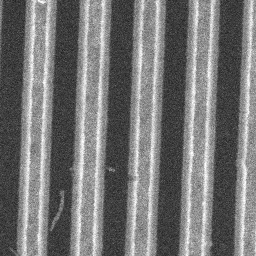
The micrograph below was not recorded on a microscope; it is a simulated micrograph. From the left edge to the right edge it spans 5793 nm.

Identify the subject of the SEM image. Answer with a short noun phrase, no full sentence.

parallel lines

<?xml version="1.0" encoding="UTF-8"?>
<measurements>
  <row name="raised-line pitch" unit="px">54.4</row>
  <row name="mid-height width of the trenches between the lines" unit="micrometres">0.726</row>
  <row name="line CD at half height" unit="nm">492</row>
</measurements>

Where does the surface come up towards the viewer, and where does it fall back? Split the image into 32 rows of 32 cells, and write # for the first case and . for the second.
....##.....##....###....###....#
....##.....##....###....###....#
....##....###....###....###....#
....##....###....###....###....#
....##....###....###....###....#
....##....###....###....###....#
....##....###....###....###....#
....##....###....###....###....#
....##....###....###....###....#
....##....###....###....###....#
...###....###....###....###....#
...###....###....###....##.....#
...###....###....###....##.....#
...###....###....###....##.....#
...###....###....###....##....##
...###....###....###....##....##
...###....###....##.....##....##
...###....###....##.....##....##
...###....###....##....###....##
...###....###....##....###....##
...###....###....##....###....##
...###....##.....##....###....##
...###....##.....##....###....##
...###....##.....##....###....##
...###....##.....##....###....##
...##.....##.....##....###....##
...##.....##....###....###....##
...##.....##....###....###....##
...##....###....###....###....##
...##....###....###....###....##
...##....###....###....###....##
...##....###....###....###....##